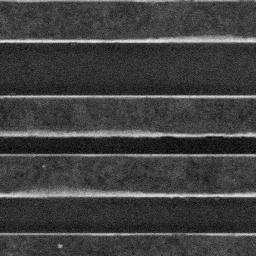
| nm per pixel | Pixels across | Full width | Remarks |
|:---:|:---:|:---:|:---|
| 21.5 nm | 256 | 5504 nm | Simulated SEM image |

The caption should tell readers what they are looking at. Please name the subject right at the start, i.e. lines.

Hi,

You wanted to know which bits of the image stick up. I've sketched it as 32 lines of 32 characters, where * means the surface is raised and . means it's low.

********************************
********************************
********************************
********************************
********************************
................................
................................
................................
................................
................................
................................
................................
********************************
********************************
********************************
********************************
********************************
................................
................................
********************************
********************************
********************************
********************************
********************************
....................*********...
................................
................................
................................
................................
********************************
********************************
********************************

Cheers